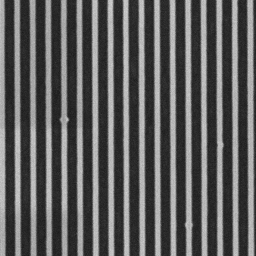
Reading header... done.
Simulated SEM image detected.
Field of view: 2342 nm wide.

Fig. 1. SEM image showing parallel lines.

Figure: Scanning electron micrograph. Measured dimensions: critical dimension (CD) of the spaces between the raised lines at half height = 92.6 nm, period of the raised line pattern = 142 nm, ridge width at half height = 42.3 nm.